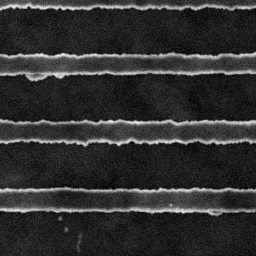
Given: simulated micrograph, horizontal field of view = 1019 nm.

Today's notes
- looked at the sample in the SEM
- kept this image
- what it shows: lines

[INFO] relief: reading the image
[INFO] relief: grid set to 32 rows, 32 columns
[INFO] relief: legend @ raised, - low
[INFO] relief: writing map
@@@@@@@@@@@@@@@@@@@@@@@@@@@@@@@@
--------------------------------
--------------------------------
--------------------------------
--------------------------------
--------------------------------
--------------------------------
@@@@@@@@@@@@@@@@@@@@@@@@@@@@@@@@
@@@@@@@@@@@@@@@@@@@@@@@@@@@@@@@@
---@@@--------------------------
--------------------------------
--------------------------------
--------------------------------
--------------------------------
--------------------------------
@@@@@@@@@@@@@@@@@@@@@@@@@@@@@@@@
@@@@@@@@@@@@@@@@@@@@@@@@@@@@@@@@
@@@@@@@@@@@@@@@@@@@@@@@@@@@@@@@@
--------------------------------
--------------------------------
--------------------------------
--------------------------------
--------------------------------
--------------------------------
@@@@@@@@@@@@@@@@@@@@@@@@@@@@@@@@
@@@@@@@@@@@@@@@@@@@@@@@@@@@@@@@@
--------@----@----@@--@@@@@@@@-@
--------------------------------
--------------------------------
--------------------------------
--------------------------------
--------------------------------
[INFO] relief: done